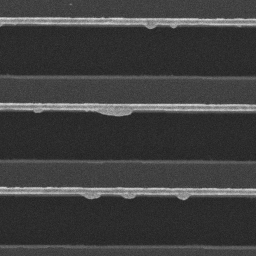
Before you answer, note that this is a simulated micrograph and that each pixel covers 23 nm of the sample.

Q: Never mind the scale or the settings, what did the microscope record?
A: lines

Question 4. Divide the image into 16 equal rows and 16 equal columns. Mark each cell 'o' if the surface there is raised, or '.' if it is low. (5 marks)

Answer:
oooooooooooooooo
o......ooooooooo
................
................
................
oooooooooooooooo
oooooooooooooooo
................
................
................
oooooooooooooooo
oooooooooooooooo
................
................
................
oooooooooooooo..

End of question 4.